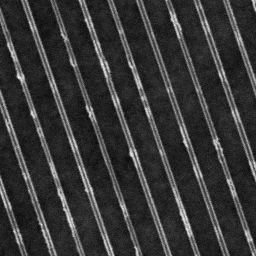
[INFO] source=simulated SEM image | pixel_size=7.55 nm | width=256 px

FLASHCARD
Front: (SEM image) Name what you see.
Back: parallel lines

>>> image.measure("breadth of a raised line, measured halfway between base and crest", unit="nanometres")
30.4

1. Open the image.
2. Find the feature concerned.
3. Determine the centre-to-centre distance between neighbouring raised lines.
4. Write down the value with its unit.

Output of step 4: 0.206 microns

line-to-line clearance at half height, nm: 172